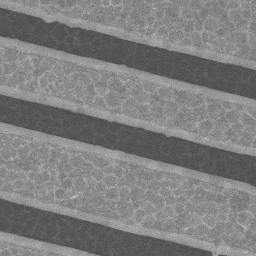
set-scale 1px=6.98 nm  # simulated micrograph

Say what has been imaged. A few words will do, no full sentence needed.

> one or a few lines or trenches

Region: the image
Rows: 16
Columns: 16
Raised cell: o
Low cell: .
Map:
.ooooooooooooooo
.....ooooooooooo
.........ooooooo
oooo.........ooo
oooooooo........
oooooooooooo....
....oooooooooooo
........oooooooo
oo..........oooo
oooooo..........
oooooooooo......
oooooooooooooo..
.ooooooooooooooo
.....ooooooooooo
.........ooooooo
ooo..........ooo